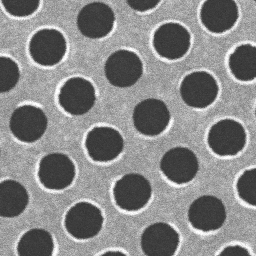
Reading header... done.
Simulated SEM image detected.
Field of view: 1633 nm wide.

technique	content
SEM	a regular array of holes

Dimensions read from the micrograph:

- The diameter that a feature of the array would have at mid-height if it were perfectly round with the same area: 243 nm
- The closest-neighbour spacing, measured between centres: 351 nm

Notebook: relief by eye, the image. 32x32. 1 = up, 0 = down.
00000111111001110000111110000011
10001111110000111111111110000011
11111111110000111111111110000011
11111111110000111111000111000111
11110000111001111110000011111111
11110000111111111110000011111111
11110000111111000111000111111000
00110000111110000011111111111000
00111111111110000011111111111000
00111111111110000011111000011000
00111111000111000111111000011111
01111110000011111111110000011111
11111110000011111100111000011111
11000111000111111000011100111111
10000011111111111000011111111111
10000011111111111000011111100011
10000011111000011000111111000001
11000111111000011111111111000001
11111111111000011111110111000011
11111100111000011111000011111111
11111000011111111111000001111111
11111000011111111111000001111100
10111000011111100011100011111100
00011100111111000001111111111100
00001111111111000001111110011100
00011111100111100011111100001110
00011111000001111111111000001111
11111111000001111111111100001111
11111111000001111100001100011111
11100011100011111100001111111111
11000001111111111100001111111111
11000001111110011100001111110001